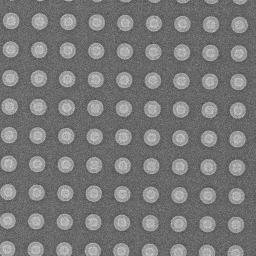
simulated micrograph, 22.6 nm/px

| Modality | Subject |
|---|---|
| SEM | an array of small figures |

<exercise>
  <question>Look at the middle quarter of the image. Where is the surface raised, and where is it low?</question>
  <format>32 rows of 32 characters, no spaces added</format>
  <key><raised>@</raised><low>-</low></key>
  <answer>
--------------------------------
--------------------------------
@@-----@@-----@@-----@@-----@@--
@@@---@@@@---@@@@---@@@@----@@@-
@@@---@@@@---@@@@---@@@@---@@@@-
@@-----@@-----@@-----@@@----@@@-
--------------------------------
--------------------------------
--------------------------------
@@-----@@-----@@-----@@---------
@@@---@@@@---@@@@---@@@@---@@@@-
@@@---@@@@---@@@@---@@@@---@@@@-
@@-----@@-----@@----@@@@----@@@-
--------------------------------
--------------------------------
--------------------------------
@@-----@@-----@@----------------
@@----@@@@---@@@@---@@@@---@@@@-
@@----@@@@---@@@@---@@@@---@@@@-
@@----@@@----@@@----@@@@---@@@@-
--------------------------------
--------------------------------
--------------------------------
@------@------------------------
@@----@@@----@@@----@@@----@@@@-
@@----@@@----@@@@---@@@@---@@@@-
@@----@@@----@@@----@@@@---@@@@-
----------------------------@@--
--------------------------------
--------------------------------
@-------------------------------
@@----@@@----@@@----@@@----@@@--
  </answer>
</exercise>